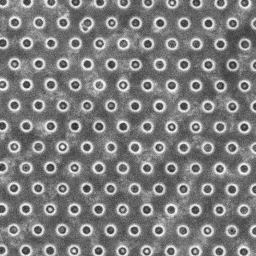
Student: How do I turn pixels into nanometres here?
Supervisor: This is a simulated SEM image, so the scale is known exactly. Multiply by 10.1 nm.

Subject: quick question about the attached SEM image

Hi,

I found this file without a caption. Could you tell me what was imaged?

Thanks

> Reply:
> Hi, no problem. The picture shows a regular array of holes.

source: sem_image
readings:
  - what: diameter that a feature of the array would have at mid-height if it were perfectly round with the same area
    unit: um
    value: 0.0907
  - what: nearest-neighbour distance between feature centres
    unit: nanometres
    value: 240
